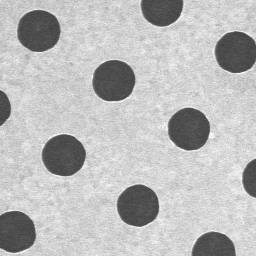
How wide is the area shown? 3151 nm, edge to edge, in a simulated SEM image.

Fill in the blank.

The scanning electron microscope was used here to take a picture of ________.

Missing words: holes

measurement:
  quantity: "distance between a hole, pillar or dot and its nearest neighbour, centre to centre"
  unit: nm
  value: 1100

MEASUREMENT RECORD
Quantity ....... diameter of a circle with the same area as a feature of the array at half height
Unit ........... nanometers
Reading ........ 527